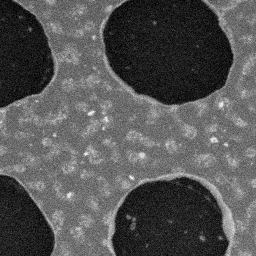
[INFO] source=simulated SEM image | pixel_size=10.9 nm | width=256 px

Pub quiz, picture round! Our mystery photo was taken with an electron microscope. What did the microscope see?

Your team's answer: holes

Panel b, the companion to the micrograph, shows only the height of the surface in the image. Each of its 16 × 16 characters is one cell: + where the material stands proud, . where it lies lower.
..+++++......+++
...++++.......++
...+++........++
...++++........+
...++++.......++
...+++++......++
.+++++++++.+++++
++++++++++++++++
++++++++++++++++
++++++++++++++++
++++++++++++++++
.++++++++....+++
..++++++......++
...++++.......++
...++++.......++
...++++.......++